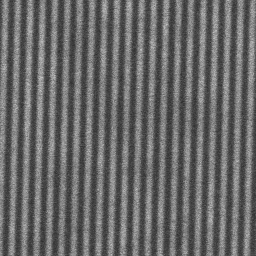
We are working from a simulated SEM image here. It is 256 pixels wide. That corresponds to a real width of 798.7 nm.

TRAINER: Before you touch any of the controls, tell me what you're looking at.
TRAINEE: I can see parallel lines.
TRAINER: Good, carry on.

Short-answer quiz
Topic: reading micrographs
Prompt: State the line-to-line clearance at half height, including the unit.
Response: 0.0211 µm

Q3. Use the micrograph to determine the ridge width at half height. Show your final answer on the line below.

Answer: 18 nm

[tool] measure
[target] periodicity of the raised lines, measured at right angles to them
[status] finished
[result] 38.7 nanometers